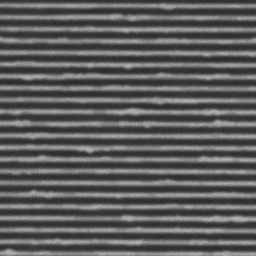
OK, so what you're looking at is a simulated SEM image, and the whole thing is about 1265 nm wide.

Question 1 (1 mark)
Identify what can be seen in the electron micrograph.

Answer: parallel lines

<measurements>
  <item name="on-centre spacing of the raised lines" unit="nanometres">58.4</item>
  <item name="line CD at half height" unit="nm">24.7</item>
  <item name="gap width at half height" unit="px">7.51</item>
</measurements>